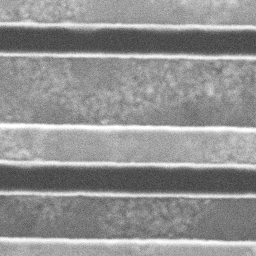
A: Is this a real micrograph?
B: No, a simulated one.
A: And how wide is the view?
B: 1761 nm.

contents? lines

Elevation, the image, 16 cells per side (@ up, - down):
@@@@@@@@@@@@@@@@
@@@@@@@@@@@@@@@@
@@@@@@@@@@@@@@@@
------@@@@@@@@@@
----------------
----------------
----------------
----------------
@@@@@@@@@@@@@@@@
@@@@@@@@@@@@@@@@
@@@@@@@@@@@@@@@@
@@@@@@@@@@@@@@@@
----------------
----------------
----------------
@@@@@@@@@@@@@@@@